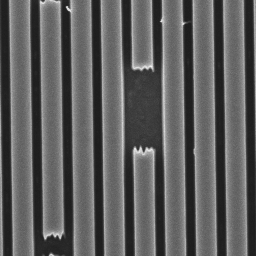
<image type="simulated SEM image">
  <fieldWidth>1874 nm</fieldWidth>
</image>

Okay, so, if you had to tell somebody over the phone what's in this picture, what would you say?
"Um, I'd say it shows parallel lines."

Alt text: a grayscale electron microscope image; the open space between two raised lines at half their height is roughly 63.1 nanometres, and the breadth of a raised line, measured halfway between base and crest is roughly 161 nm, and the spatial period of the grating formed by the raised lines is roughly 224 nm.